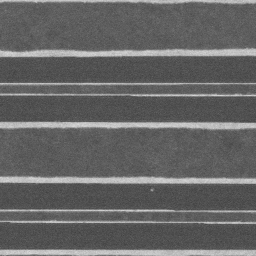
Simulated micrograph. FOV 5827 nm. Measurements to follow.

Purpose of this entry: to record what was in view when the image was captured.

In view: lines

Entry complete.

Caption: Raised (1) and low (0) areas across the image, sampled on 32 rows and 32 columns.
11111111111111111111111111111111
11111111111111111111111111111111
11111111111111111111111111111111
11111111111111111111111111111111
11111111111111111111111111111111
11111111111111111111111111111111
11111111111111111111111111111110
00000000000000000000000000000000
00000000000000000000000000000000
00000000000000000000000000000000
11111111111111111111111111111111
11111111111111111111111111111111
00000000000000000000000000000000
00000000000000000000000000000000
00000000000000000000000000000000
00000000000000000000000000000000
11111111111111111111111111111111
11111111111111111111111111111111
11111111111111111111111111111111
11111111111111111111111111111111
11111111111111111111111111111111
11111111111111111111111111111111
00001111111111111111111111111111
00000000000000000000000000000000
00000000000000000000000000000000
00000000000000000000000000000000
11111111111111111111111111111111
11111111111111111111111111111111
00000000000000000000000000000000
00000000000000000000000000000000
00000000000000000000000000000000
00000000000000000000000000000000